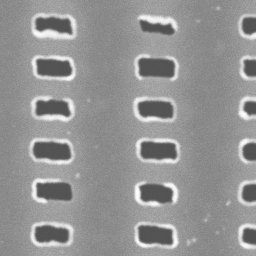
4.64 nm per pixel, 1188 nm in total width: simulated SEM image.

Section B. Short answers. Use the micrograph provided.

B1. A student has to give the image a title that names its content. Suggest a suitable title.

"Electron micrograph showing a regular array of holes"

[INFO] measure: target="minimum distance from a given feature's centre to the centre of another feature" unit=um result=0.19